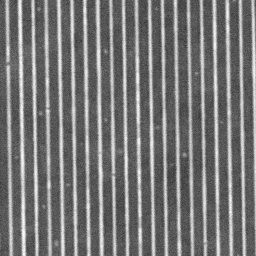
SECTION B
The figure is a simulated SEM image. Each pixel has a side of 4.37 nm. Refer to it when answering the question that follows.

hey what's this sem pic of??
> parallel lines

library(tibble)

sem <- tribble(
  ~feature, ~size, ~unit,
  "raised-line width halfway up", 8.7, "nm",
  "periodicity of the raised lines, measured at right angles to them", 56.6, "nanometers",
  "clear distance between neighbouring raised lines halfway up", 47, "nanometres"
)